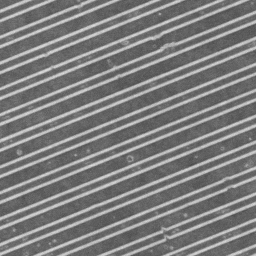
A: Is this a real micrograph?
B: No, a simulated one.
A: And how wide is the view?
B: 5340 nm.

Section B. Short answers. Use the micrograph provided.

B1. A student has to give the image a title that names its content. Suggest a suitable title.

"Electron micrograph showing parallel lines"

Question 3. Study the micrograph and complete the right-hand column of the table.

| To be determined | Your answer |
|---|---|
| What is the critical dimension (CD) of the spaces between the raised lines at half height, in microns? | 0.324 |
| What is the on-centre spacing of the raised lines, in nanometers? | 502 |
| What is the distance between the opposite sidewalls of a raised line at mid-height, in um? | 0.173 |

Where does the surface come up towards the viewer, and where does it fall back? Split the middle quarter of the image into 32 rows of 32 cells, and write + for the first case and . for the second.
++++...........+++++...........+
++..........++++++..........++++
..........+++++...........+++++.
.......++++++..........++++++...
.....+++++...........+++++......
..++++++..........++++++........
+++++...........+++++...........
+++..........++++++..........+++
...........+++++...........+++++
........++++++..........++++++..
......+++++...........++++++....
...++++++..........++++++.......
.+++++...........++++++.........
++++..........++++++...........+
+...........++++++...........+++
.........++++++...........+++++.
.......++++++...........+++++...
....++++++...........+++++......
..++++++...........+++++........
++++++..........++++++..........
+++...........+++++...........++
+..........++++++..........+++++
.........+++++...........+++++..
......++++++..........++++++....
....+++++...........+++++.......
.++++++..........++++++.........
++++...........+++++...........+
++..........++++++..........++++
..........+++++...........+++++.
.......++++++..........++++++...
.....+++++...........+++++......
..++++++..........++++++........